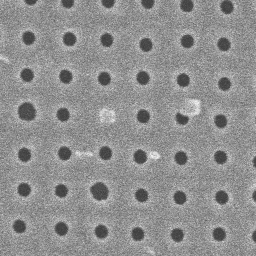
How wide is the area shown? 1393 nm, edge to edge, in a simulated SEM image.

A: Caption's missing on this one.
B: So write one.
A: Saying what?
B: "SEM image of a regular array of holes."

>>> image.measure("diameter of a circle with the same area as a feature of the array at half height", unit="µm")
0.0771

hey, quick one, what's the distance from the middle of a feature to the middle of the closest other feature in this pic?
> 0.201 micrometres